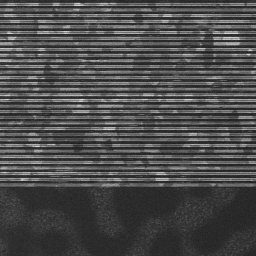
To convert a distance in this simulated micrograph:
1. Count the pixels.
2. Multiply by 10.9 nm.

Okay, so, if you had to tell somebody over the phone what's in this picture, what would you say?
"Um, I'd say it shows parallel lines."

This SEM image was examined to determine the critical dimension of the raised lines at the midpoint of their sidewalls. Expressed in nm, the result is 24.6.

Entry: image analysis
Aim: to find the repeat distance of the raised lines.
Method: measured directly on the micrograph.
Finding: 61.7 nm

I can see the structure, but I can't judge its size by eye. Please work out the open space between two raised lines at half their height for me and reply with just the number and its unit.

0.0368 um